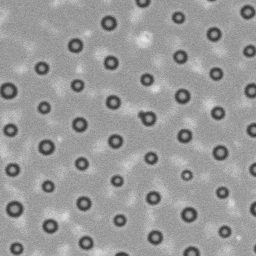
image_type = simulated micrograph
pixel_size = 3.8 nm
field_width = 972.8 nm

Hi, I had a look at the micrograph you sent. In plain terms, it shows a regular array of ring-shaped grooves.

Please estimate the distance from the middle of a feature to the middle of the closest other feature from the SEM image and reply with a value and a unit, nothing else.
149 nm